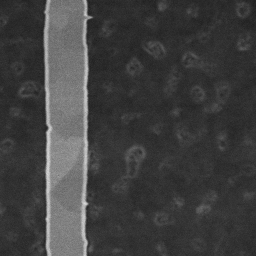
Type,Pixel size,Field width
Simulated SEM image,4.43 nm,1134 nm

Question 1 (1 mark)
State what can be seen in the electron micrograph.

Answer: one or a few lines or trenches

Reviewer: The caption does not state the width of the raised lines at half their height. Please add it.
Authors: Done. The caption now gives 169 nanometers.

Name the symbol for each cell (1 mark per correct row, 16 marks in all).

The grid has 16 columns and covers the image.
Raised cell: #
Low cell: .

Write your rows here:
...##...........
...##...........
...##...........
...##...........
...##...........
...##...........
...##...........
...##...........
...##...........
...##...........
...##...........
...##...........
...##...........
...##...........
...##...........
...##...........